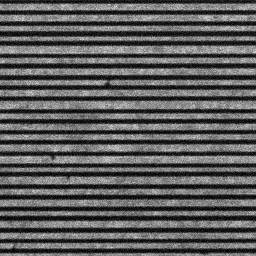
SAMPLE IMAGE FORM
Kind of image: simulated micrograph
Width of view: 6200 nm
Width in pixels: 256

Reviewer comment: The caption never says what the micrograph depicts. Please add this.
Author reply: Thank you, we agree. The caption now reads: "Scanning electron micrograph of parallel lines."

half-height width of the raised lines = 157 nm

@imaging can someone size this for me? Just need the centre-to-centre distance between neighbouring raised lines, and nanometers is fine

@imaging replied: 262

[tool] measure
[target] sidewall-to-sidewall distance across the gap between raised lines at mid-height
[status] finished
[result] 4.25 px